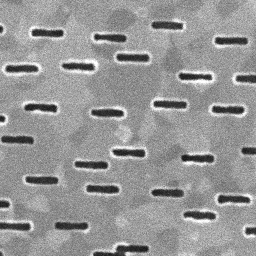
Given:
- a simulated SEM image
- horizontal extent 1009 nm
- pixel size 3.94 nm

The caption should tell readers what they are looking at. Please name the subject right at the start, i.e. a regular array of holes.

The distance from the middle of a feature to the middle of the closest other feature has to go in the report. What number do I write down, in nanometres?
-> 156